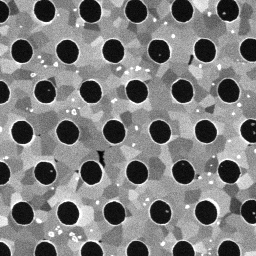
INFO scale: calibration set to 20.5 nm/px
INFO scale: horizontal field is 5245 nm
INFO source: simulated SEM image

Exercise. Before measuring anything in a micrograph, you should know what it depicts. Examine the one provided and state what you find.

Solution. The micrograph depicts a regular array of holes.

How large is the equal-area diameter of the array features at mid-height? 0.478 micrometres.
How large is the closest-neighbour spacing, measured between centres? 0.938 micrometres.